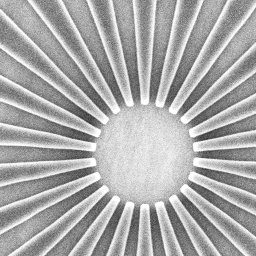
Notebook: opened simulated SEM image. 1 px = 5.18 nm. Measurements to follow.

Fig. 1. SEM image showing groups of lines, slits or small figures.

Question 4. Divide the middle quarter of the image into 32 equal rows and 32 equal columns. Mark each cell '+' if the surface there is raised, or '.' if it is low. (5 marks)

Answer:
...+++++....+++....+++...++++...
....+++++...++++...+++...+++....
.....++++....+++...++....+++...+
+.....++++...+++...++...+++....+
++....++++...+++...++...+++...++
+++....++++...++...++...++....++
++++....+++...+++..++...++...+++
+++++....+++...++..++..+++..++++
.+++++....+++..++..++..+++..+++.
..+++++...+++..++..++..++..+++..
....++++...+++.........++..++...
.....++++...++............+++..+
++.....+++....................++
++++....+++..................+++
++++++...++...................+.
.++++++.........................
...++++++.......................
......+++.......................
+...............................
+++++...........................
++++++++........................
......++........................
................................
................................
++++++++........................
++++++..........................
++..............................
.......++.......................
....+++++......................+
..++++++........................
++++++........................+.
++++....+++..................+++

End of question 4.